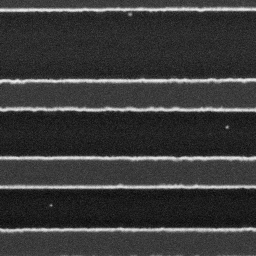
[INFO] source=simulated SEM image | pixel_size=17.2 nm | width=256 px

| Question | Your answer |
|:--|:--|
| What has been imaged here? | lines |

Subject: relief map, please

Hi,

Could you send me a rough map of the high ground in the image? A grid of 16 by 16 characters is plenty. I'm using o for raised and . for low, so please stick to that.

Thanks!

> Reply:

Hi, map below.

oooooooooooooooo
................
................
................
................
oooooooooooooooo
oooooooooooooooo
................
................
................
oooooooooooooooo
oooooooooooooooo
................
................
oooooooooooooooo
oooooooooooooooo